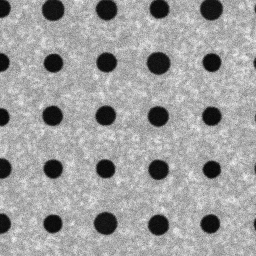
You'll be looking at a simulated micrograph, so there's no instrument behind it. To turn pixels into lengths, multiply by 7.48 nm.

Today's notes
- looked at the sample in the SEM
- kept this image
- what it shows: a regular array of holes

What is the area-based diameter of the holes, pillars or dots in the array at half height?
154 nanometres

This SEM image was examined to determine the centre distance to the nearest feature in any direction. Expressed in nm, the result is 394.